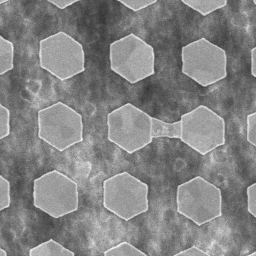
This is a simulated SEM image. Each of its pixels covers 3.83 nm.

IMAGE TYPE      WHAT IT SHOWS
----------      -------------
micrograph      a regular array of raised bodies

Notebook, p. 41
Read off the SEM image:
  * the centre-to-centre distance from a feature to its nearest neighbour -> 262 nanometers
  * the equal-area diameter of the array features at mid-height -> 173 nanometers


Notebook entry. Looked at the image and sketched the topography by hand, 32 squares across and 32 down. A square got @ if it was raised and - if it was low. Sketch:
-------@@------@@@@----@@@@@----
-------------------------@------
--------------------------------
--------------------------------
------@@@-------@---------------
@----@@@@@----@@@@------@@@-----
@@---@@@@@----@@@@@----@@@@@---@
@@---@@@@@----@@@@@----@@@@@---@
@----@@@@@----@@@@@----@@@@@----
-------@@------@@@@-----@@@@----
-------------------------@------
--------------------------------
--------------------------------
@-----@@@------@@--------@------
@----@@@@@----@@@@@----@@@@----@
@----@@@@@----@@@@@----@@@@@---@
@----@@@@@----@@@@@----@@@@@---@
-----@@@@@----@@@@@----@@@@@---@
-------@-------@@@------@@@-----
--------------------------------
--------------------------------
------@-------------------------
@----@@@@----@@@@-------@@------
@---@@@@@@---@@@@@----@@@@@----@
@---@@@@@@---@@@@@----@@@@@@---@
@---@@@@@@---@@@@@----@@@@@@---@
------@@@-----@@@@----@@@@@@---@
------------------------@@------
--------------------------------
--------------------------------
-----@@--------@----------------
@---@@@@@----@@@@@-----@@@------